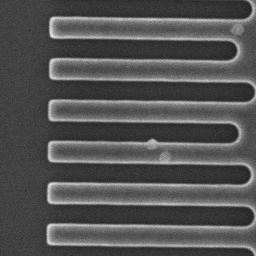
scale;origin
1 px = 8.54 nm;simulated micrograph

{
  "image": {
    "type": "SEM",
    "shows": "groups of lines, slits or small figures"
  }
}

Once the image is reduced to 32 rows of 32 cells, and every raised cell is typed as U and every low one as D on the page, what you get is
DDDDDDDDDDDDDDDDDDDDDDDDDDDDDDDU
DDDDDDDDDDDDDDDDDDDDDDDDDDDDDDDD
DDDDDDDUUUUUUUUUUUUUUUUUUUUUDDUU
DDDDDDUUUUUUUUUUUUUUUUUUUUUUUUUU
DDDDDDDUUUUUUUUUUUUUUUUUUUUUUUUU
DDDDDDDDDDDDDDDDDDDDDDDDDDDDDUUU
DDDDDDDDDDDDDDDDDDDDDDDDDDDDDDUU
DDDDDDDUUUUUDUDDDDDDDDDDDDDDDUUU
DDDDDDUUUUUUUUUUUUUUUUUUUUUUUUUU
DDDDDDUUUUUUUUUUUUUUUUUUUUUUUUUU
DDDDDDDDDDDDDDDDDDDDDDDDDDDDDDDU
DDDDDDDDDDDDDDDDDDDDDDDDDDDDDDDD
DDDDDDDDDDDDDDDDDDDDDDDDDDDDDDDU
DDDDDDUUUUUUUUUUUUUUUUUUUUUUUUUU
DDDDDDUUUUUUUUUUUUUUUUUUUUUUUUUU
DDDDDDDDDDDDDDDDDDDDDDDDDDDDDUUU
DDDDDDDDDDDDDDDDDDDDDDDDDDDDDDUU
DDDDDDDDDDDDDDDDDDDDDDDDDDDDDDUU
DDDDDDUUUUUUUUUUUUUUUUUUUUUUUUUU
DDDDDDUUUUUUUUUUUUUUUUUUUUUUUUUU
DDDDDDDDDDDDDDDDDDDDDDDDDDDDDDUU
DDDDDDDDDDDDDDDDDDDDDDDDDDDDDDDU
DDDDDDDDDDDDDDDDDDDDDDDDDDDDDDDU
DDDDDDUUUUUUUUUUUUUUUUUUUUUUUUUU
DDDDDDUUUUUUUUUUUUUUUUUUUUUUUUUU
DDDDDDDDDDDDDDDDDDDUUUUUUUUUUUUU
DDDDDDDDDDDDDDDDDDDDDDDDDDDDDDDD
DDDDDDDDDDDDDDDDDDDDDDDDDDDDDDDD
DDDDDDUUUUUUUUUUUUUUUUUUUUUUUUUU
DDDDDDUUUUUUUUUUUUUUUUUUUUUUUUUU
DDDDDDUUUUUUUUUUUUUUUUUUUUUUUUUU
DDDDDDDDDDDDDDDDDDDDDDDDDDDDDDDD